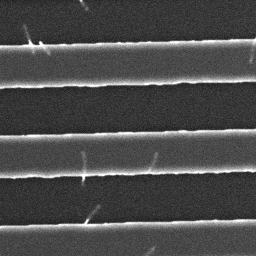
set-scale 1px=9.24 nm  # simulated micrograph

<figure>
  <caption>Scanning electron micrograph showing lines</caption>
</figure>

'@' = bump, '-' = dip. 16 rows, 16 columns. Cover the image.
----------------
----------------
--------------@@
@@@@@@@@@@@@@@@@
@@@@@@@@@@@@@@@@
@---------------
----------------
----------------
-@@@@@@@@@@@@@@@
@@@@@@@@@@@@@@@@
@@@@@@@@@@@@@@@@
----------------
----------------
----------------
@@@@@@@@@@@@@@@@
@@@@@@@@@@@@@@@@